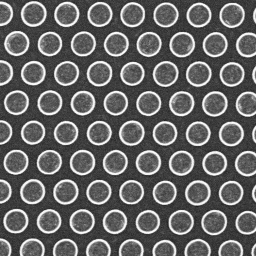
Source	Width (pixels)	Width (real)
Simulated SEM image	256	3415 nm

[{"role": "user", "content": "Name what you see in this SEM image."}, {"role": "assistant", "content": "a regular array of raised bodies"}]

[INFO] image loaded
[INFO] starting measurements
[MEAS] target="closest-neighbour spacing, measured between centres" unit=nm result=440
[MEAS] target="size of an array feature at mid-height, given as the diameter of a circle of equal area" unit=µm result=0.309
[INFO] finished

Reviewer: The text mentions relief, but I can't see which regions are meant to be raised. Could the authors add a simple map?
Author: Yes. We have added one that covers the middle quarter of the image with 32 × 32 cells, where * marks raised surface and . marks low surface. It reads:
***....****....****....*****....
***...******...*****...*****...*
***...******..******...*****...*
***...******...*****...*****...*
***....****....****....****....*
................................
................................
...***.....****.....***.....***.
..*****....****....*****...*****
..*****...******..******...*****
..*****...******..******...*****
...****....****....****....*****
....*.......**......**......***.
................................
................**..............
***....****....****....****.....
***...******..******...*****...*
***...******..******...*****...*
***...*****...*****....*****...*
**.....****....****....****.....
................................
................................
...****....****....****.....***.
..*****...*****....*****...*****
..*****...******..******...*****
..*****...*****...******...*****
..*****....****....****....*****
....*........................*..
................................
**......**......**......**......
***...*****....****....****....*
***...******..******...*****...*